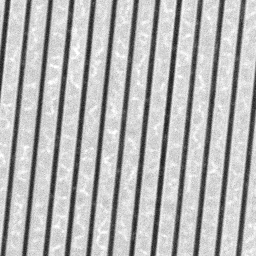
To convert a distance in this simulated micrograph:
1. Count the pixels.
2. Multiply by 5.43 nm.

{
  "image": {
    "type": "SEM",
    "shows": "parallel lines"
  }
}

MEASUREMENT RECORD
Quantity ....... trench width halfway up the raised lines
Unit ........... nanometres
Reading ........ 32.4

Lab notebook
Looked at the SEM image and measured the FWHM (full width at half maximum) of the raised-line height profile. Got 80.3 nanometres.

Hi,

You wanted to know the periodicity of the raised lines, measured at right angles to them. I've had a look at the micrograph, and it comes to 116 nm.